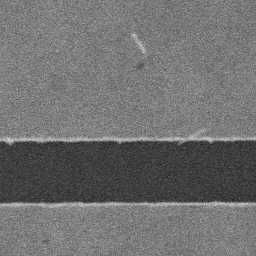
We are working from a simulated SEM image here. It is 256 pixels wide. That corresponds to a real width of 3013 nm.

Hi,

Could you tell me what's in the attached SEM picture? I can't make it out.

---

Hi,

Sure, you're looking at one or a few lines or trenches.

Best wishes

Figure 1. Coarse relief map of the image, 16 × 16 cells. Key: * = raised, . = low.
****************
****************
****************
****************
****************
****************
****************
****************
****************
................
................
................
................
****************
****************
****************